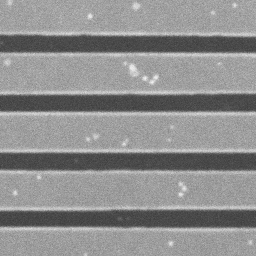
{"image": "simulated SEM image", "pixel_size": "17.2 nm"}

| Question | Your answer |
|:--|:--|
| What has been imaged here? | lines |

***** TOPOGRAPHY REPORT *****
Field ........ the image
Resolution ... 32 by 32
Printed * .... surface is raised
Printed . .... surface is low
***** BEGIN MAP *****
********************************
********************************
********************************
********************************
................................
................................
................................
********************************
********************************
********************************
********************************
********************************
................................
................................
********************************
********************************
********************************
********************************
********************************
................................
................................
********************************
********************************
********************************
********************************
********************************
................................
................................
***************.***.............
********************************
********************************
********************************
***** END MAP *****